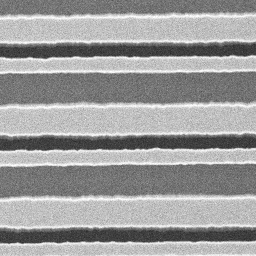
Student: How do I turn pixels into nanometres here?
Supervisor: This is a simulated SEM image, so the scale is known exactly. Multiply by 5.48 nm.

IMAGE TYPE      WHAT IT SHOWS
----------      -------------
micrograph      lines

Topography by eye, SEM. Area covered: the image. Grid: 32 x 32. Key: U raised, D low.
DDDDDDDDDDDDDDDDDDDDDDDDDDDDDDDD
DDDDDDDDDDDDDDDDDDDDDDDDDDDDDDDD
UUUUUUUUUUUUUUUUUUUUUUUUUUUUUUUU
UUUUUUUUUUUUUUUUUUUUUUUUUUUUUUUU
UUUUUUUUUUUUUUUUUUUUUUUUUUUUUUUU
DUUUDDDDDDDDDDDDDDDDDDDDDDDDDDDD
DDDDDDDDDDDDDDDDDDDDDDDDDDDDDDDD
UUUUUUUUUUUUUUUUUUUUUUUUUUUUUUUU
UUUUUUUUUUUUUUUUUUUUUUUUUUUUUUUU
DDDDDDDDDDDDDDDDDDDDDDDDDDDDDDDD
DDDDDDDDDDDDDDDDDDDDDDDDDDDDDDDD
DDDDDDDDDDDDDDDDDDDDDDDDDDDDDDDD
DDDDDDDDDDDDDDDDDDDDDDDDDDDDDDDD
UUUUUUUUUUUUUUUUUUUUUUUUUUUUUUUU
UUUUUUUUUUUUUUUUUUUUUUUUUUUUUUUU
UUUUUUUUUUUUUUUUUUUUUUUUUUUUUUUU
UUUUUUUUUUUUUUUUUUUUUUUUUUUUUUUU
DDDDDDDDDDDDDDDDDDDDDDDDDDDDDDDD
DDDDDDDDDDDDDDDDDDDDDDDDDDDDDDDD
UUUUUUUUUUUUUUUUUUUUUUUUUUUUUUUU
UUUUUUUUUUUUUUUUUUUUUUUUDDUDDDDD
DDDDDDDDDDDDDDDDDDDDDDDDDDDDDDDD
DDDDDDDDDDDDDDDDDDDDDDDDDDDDDDDD
DDDDDDDDDDDDDDDDDDDDDDDDDDDDDDDD
DDDDDDDDDDDDDDDDDDDDDDDDDDDDDDDD
UUUUUUUUUUUUUUUUUUUUUUUUUUUUUUUU
UUUUUUUUUUUUUUUUUUUUUUUUUUUUUUUU
UUUUUUUUUUUUUUUUUUUUUUUUUUUUUUUU
UUUUUUUUUDDUUDDDDDDDUDDUUUDDDDDD
DDDDDDDDDDDDDDDDDDDDDDDDDDDDDDDD
DDDDDUUUUUUUUUUUUUUUUUUUUUUUUUUU
UUUUUUUUUUUUUUUUUUUUUUUUUUUUUUUU